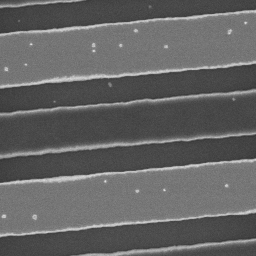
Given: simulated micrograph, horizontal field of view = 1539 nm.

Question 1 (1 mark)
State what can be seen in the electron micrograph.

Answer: lines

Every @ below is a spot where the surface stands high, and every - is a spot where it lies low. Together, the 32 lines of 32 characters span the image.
@@@@----------------------------
-----------------------------@@@
------------------@@@@@@@@@@@@@@
--------@@@@@@@@@@@@@@@@@@@@@@@@
@@@@@@@@@@@@@@@@@@@@@@@@@@@@@@@@
@@@@@@@@@@@@@@@@@@@@@@@@@@@@@@@@
@@@@@@@@@@@@@@@@@@@@@@@@@@@@@@@@
@@@@@@@@@@@@@@@@@@@@@@@@@@@@@@@@
@@@@@@@@@@@@@@@@@@@@@@@@@@@-----
@@@@@@@@@@@@@@@@----------------
@@@@@---------------------------
------------------------------@@
------------------@@@@@@@@@@@@@@
-------@@@@@@@@@@@@@@@@@@@@@@@@@
@@@@@@@@@@@@@@@@@@@@@@@@@@@@@@@@
@@@@@@@@@@@@@@@@@@@@@@@@@@@@@@@@
@@@@@@@@@@@@@@@@@@@@@@@@@@@@@@@@
@@@@@@@@@@@@@@@@@@@@@@@@--------
@@@@@@@@@@@@--------------------
@@------------------------------
-------------------------@@@@@@@
---------------@@@@@@@@@@@@@@@@@
----@@@@@@@@@@@@@@@@@@@@@@@@@@@@
@@@@@@@@@@@@@@@@@@@@@@@@@@@@@@@@
@@@@@@@@@@@@@@@@@@@@@@@@@@@@@@@@
@@@@@@@@@@@@@@@@@@@@@@@@@@@@@@@@
@@@@@@@@@@@@@@@@@@@@@@@@@@@@@@@@
@@@@@@@@@@@@@@@@@@@@@@@---------
@@@@@@@@@@@@--------------------
@-------------------------------
--------------------------@@@@@@
---------------@@@@@@@@@@@@@@@@@